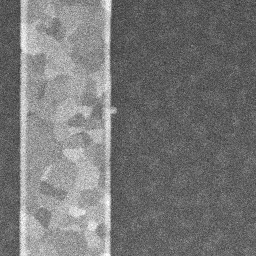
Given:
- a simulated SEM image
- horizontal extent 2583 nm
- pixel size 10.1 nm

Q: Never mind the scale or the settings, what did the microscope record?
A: one or a few lines or trenches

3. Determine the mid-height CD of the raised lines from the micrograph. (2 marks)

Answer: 858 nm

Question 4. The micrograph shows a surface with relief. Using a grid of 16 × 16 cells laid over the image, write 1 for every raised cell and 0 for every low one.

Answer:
0111111000000000
0111111000000000
0111111000000000
0111111000000000
0111111000000000
0111111000000000
0111111000000000
0111111000000000
0111111000000000
0111111000000000
0111111000000000
0111111000000000
0111111000000000
0111111000000000
0111111000000000
0111111000000000